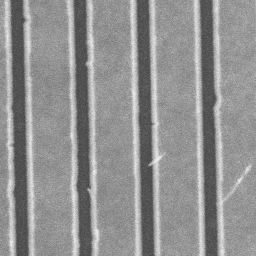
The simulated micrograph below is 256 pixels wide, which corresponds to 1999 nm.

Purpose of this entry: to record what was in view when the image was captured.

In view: one or a few lines or trenches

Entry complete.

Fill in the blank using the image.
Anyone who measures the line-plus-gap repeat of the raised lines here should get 492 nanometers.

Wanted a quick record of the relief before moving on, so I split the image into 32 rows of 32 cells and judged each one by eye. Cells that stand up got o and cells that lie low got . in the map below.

o..oooooo..oooooo..oooooo..ooooo
o..oooooo..oooooo..oooooo..ooooo
o..oooooo..oooooo..oooooo..ooooo
o..oooooo..oooooo..oooooo..ooooo
o..oooooo..oooooo..oooooo..ooooo
o..oooooo..oooooo..oooooo..ooooo
o..oooooo..oooooo..oooooo..ooooo
o..oooooo..oooooo..oooooo..ooooo
o..oooooo..oooooo..oooooo..ooooo
o..oooooo..oooooo..oooooo..ooooo
o...ooooo..oooooo..oooooo..ooooo
o...ooooo..oooooo..oooooo..ooooo
o..oooooo..oooooo..oooooo..ooooo
o...ooooo..oooooo..oooooo..ooooo
o...ooooo..oooooo..oooooo..ooooo
o...ooooo..oooooo..oooooo..ooooo
o...ooooo...ooooo..oooooo..ooooo
o...ooooo..oooooo..oooooo..ooooo
o...ooooo...ooooo..oooooo..ooooo
o...ooooo..oooooo..oooooo..ooooo
o...ooooo..oooooo..oooooo..ooooo
oo..ooooo...ooooo..oooooo..ooooo
oo..ooooo...ooooo..oooooo..ooooo
o...ooooo...ooooo..oooooo..ooooo
o...ooooo...ooooo..oooooo..ooooo
oo..ooooo...ooooo..oooooo..ooooo
oo..oooooo..ooooo..oooooo..ooooo
oo..oooooo..ooooo...ooooo...oooo
oo..oooooo..ooooo...ooooo...oooo
oo..oooooo..ooooo...ooooo...oooo
oo..oooooo..ooooo...ooooo...oooo
oo..oooooo..ooooo...ooooo...oooo